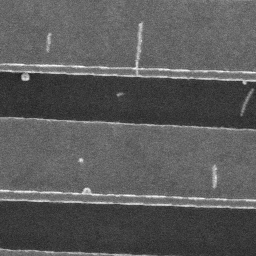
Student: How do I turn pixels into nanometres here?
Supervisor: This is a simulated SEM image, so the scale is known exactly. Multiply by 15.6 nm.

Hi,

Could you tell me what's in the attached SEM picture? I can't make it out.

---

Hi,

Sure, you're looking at lines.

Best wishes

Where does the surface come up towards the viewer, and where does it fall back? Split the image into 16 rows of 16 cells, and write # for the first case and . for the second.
################
################
################
################
.###############
................
................
####............
################
################
################
################
################
................
................
................